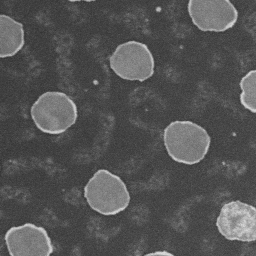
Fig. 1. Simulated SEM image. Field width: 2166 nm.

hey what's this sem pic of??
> raised bodies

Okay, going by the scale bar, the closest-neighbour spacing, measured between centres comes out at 796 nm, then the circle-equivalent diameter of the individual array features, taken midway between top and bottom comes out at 0.36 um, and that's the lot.